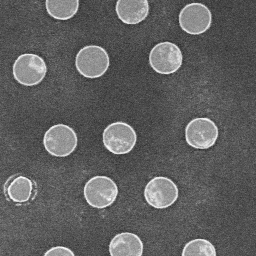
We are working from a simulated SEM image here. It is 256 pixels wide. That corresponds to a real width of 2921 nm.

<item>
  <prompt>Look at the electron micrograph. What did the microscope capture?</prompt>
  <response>a regular array of raised bodies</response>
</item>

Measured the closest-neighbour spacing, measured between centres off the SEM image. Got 684 nanometres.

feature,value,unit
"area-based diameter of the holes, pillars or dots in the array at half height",0.36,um